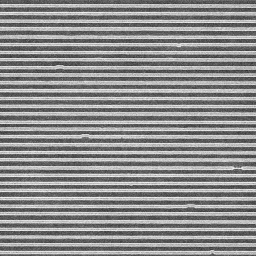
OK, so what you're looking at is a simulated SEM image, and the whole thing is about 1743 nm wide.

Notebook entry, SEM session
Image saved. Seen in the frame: parallel lines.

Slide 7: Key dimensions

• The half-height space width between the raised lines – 5.37 pixels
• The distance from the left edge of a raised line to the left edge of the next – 52.5 nanometres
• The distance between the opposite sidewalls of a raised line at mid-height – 18.7 nm